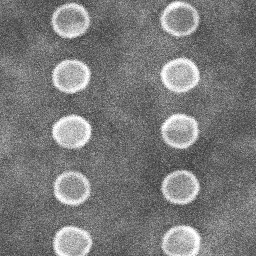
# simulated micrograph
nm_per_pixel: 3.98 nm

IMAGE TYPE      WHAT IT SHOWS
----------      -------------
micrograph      a regular array of raised bodies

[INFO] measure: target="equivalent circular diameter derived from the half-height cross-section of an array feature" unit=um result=0.132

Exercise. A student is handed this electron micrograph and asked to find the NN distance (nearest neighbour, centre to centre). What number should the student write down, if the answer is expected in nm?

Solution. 222